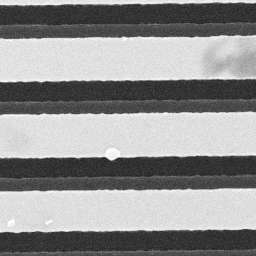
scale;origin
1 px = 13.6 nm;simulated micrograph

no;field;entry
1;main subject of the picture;lines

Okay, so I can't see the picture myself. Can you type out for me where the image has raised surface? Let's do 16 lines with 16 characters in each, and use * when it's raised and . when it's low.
................
................
****************
****************
****************
................
................
****************
****************
****************
................
................
****************
****************
**..............
................